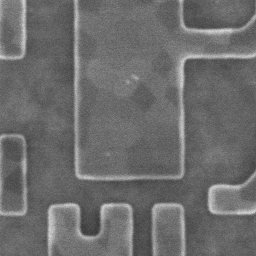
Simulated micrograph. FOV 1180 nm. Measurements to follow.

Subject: wiring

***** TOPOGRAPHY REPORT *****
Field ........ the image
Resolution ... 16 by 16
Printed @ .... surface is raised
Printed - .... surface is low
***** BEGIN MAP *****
@@---@@@@@@-----
@@---@@@@@@@---@
@@---@@@@@@@@@@@
@----@@@@@@@@@@@
-----@@@@@@-----
-----@@@@@@-----
-----@@@@@@-----
-----@@@@@@-----
@----@@@@@@-----
@@---@@@@@@-----
@@---@@@@@@-----
@@-------------@
@@-----------@@@
---@@-@@--@-----
---@@-@@--@@----
---@@@@@--@@----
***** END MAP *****